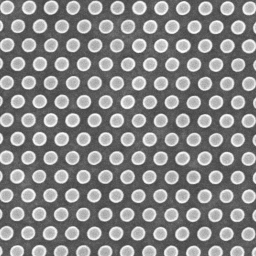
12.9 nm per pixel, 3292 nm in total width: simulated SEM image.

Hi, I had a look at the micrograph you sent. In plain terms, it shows a regular array of raised bodies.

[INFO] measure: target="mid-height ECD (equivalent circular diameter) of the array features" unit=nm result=167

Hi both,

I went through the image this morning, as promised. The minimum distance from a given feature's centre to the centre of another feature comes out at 0.276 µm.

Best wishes